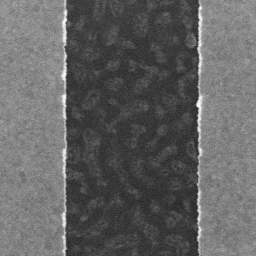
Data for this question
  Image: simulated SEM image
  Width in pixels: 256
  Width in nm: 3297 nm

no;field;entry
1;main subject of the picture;one or a few lines or trenches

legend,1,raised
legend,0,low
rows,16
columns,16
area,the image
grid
1111000000001111
1111000000001111
1111000000001111
1111000000001111
1111000001001111
1111000000001111
1111000000001111
1111000000001111
1111000000001111
1111000000001111
1111000000001111
1111000000001111
1111000000001111
1111000000001111
1111000000001111
1111000000001111